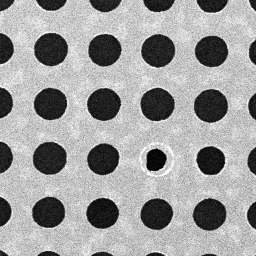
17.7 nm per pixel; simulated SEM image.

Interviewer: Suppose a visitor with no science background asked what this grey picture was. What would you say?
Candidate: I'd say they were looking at a regular array of holes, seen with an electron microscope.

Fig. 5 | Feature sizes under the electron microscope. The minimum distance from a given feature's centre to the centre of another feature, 948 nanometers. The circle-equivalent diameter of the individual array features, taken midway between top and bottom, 588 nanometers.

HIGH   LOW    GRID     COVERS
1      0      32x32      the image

00111000111000011100001110001110
11111111111111111111111111011111
11111111111111111111111111111111
11111111111111111111111111111111
01111000111100111110011111011111
00110000111000011100001110001110
00110000111000011100001100000110
01111000111000011100011110001110
11111111111111111111111111111111
11111111111111111111111111111111
11111111111111111111111111111111
01111000111100111100011110001111
00110000111000011100001100001110
00110000111000011100001100001110
01111000111000111100011110001110
11111111111111111111111111111111
11111111111111111111111111111111
11111111111111111111111111111111
01111000111100111111111110011111
00110000111000011100011110001110
01110000111000011100011110001110
11111001111100111111111110011110
11111111111111111111111111111111
11111111111111111111111111111111
11111111111111111111111111111111
01110000111000111100011110001110
01110000111000011100001100001110
01110000111000011100011100001110
11111111111100111110111110011111
11111111111111111111111111111111
11111111111111111111111111111111
01111001111101111111111111111111